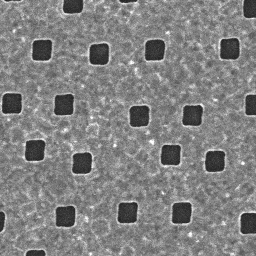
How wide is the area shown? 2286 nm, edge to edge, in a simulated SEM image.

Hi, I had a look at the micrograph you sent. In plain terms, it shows a regular array of holes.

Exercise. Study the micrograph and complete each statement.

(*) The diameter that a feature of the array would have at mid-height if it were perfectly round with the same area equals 0.204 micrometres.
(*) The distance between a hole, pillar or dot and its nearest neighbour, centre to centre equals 463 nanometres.